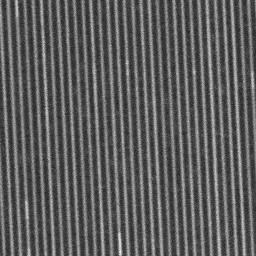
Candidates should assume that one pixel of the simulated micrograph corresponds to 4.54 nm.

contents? parallel lines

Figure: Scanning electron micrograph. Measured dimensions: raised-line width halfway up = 8.5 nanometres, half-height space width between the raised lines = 26.1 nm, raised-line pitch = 37.6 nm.